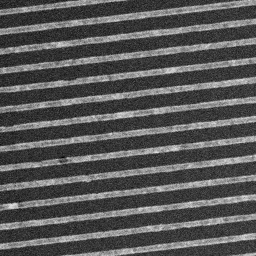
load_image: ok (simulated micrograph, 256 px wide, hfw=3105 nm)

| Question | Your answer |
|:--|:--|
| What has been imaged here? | parallel lines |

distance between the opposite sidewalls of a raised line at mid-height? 63.3 nm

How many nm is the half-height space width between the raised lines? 172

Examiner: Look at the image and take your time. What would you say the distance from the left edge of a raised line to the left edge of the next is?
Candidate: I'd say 19.4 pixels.